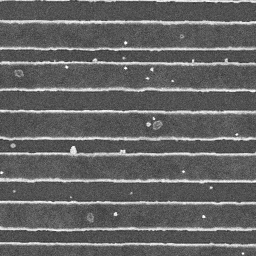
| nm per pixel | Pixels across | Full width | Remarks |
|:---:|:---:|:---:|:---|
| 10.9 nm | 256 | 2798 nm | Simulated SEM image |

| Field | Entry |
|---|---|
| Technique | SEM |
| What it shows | lines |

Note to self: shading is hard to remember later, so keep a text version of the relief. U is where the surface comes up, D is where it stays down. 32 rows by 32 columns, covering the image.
DDDDDDDDDDDDDDDDDDDDDDDDDDDDDDDD
DDDDDDDDDDDDDDDDDDDDDDDDDDDDDDDD
DDDDDDDDDDDDDDDDDDDDDDDDDDDDDDDD
UUUUUUUUUUUUUUUUUUUUUUUUUUUUUUUU
UUUUUUUUUUUUUUUUUUUUUUUUUUUUUUUU
UUUUUUUUUUUUUUUUUUUUUUUUUUUUUUUU
DDDDDDDDDDDDDDDDDDDDDDDDDDDDDDDD
DDDDDDDDDDDDDDDDDDDDDDDDDDDDDDDD
UUUUUUUUUUUUUUUUUUUUUUUUUUUUUUUU
UUUUUUUUUUUUUUUUUUUUUUUUUUUUUUUU
UUUUUUUUUUUUUUUUUUUUUUUUUUUUUUUU
DDDDDDDDDDDDDDDDDDDDDDDDDDDDDDDD
DDDDDDDDDDDDDDDDDDDDDDDDDDDDDDDD
DDDDDDDDDDDDDDDDDDDDDDDDDDDDDDDD
UUUUUUUUUUUUUUUUUUUUUUUUUUUUUUUU
UUUUUUUUUUUUUUUUUUUUUUUUUUUUUUUU
UUUUUUUUUUUUUUUUUUUUUUUUUUUUUUUU
DDDDDDDDDDDDDDDDDDDDDDDDDDDDDDDD
DDDDDDDDDDDDDDDDDDDDDDDDDDDDDDDD
UUUUUUUUUUUUUUUUUUUUUUUUUUUUUUUU
UUUUUUUUUUUUUUUUUUUUUUUUUUUUUUUU
UUUUUUUUUUUUUUUUUUUUUUUUUUUUUUUU
UUUUUUUUUUUUUUUUUUUUUUUUUUUUUUUU
DDDDDDDDDDDDDDDDDDDDDDDDDDDDDDDD
DDDDDDDDDDDDDDDDDDDDDDDDDDDDDDDD
UUUUUUUUUUUUUUUUUUUUUUUUUUUUUUUU
UUUUUUUUUUUUUUUUUUUUUUUUUUUUUUUU
UUUUUUUUUUUUUUUUUUUUUUUUUUUUUUUU
UUUUUUUUUUUUUUUUUUUUUUUUUUUUUUUU
DDDDDDDDDDDDDDDDDDDDDDDDDDDDDDDD
UUUUUUUUDDUDDDDDUDDDDDDDDDDDDDDD
UUUUUUUUUUUUUUUUUUUUUUUUUUUUUUUU